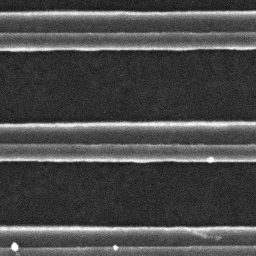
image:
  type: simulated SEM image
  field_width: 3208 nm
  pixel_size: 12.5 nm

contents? lines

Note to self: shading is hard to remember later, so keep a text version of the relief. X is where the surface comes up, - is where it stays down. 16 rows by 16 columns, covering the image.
----------------
XXXXXXXXXXXXXXXX
XXXXXXXXXXXXXXXX
----------------
----------------
----------------
----------------
----------------
XXXXXXXXXXXXXXXX
XXXXXXXXXXXXXXXX
----------------
----------------
----------------
----------------
XXXXXXXXXXXXXXXX
XXXXXXXXXXXXXXXX